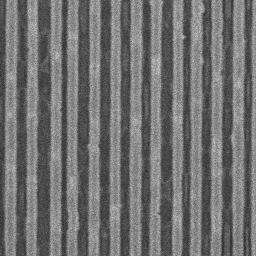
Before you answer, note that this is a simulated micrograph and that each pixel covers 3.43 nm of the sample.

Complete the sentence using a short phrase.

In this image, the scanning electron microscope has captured parallel lines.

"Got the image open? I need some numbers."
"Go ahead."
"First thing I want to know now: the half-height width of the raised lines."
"34.3 nm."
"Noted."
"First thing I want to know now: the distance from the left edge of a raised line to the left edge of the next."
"70.9 nm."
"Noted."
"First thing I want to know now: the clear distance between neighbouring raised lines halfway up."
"37.7 nanometres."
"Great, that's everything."